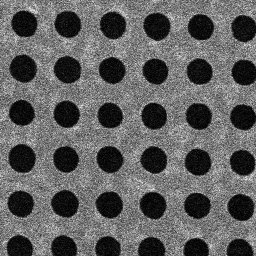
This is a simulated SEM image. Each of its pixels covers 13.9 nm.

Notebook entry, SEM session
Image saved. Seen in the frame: a regular array of holes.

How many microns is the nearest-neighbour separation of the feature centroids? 0.609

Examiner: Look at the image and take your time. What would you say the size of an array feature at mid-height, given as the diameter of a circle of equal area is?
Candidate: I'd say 374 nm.